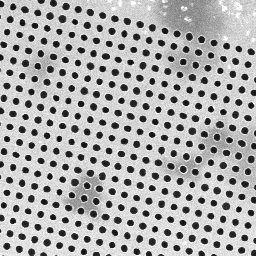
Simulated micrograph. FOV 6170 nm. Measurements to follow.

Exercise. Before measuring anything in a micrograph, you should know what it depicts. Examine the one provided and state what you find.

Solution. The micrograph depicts a regular array of holes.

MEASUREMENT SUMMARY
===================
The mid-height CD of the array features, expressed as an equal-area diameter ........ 172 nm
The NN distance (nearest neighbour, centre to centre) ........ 303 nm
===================